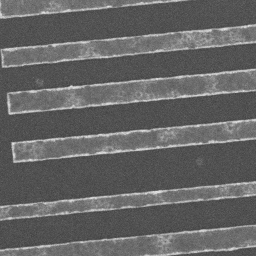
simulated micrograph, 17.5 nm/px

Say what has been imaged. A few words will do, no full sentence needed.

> parallel lines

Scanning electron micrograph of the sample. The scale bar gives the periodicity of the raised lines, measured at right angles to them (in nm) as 888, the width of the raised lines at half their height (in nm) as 326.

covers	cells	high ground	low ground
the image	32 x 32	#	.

##################..............
########........................
................................
............................####
..................##############
.......#######################..
####################............
#########.......................
................................
.......................#########
.............###################
..############################..
.##################.............
.########.......................
................................
...........................#####
................################
......########################..
..##################............
..########......................
................................
................................
................................
........................########
..............#################.
....#################...........
##########......................
#...............................
............................####
..................##############
........########################
#########################.......